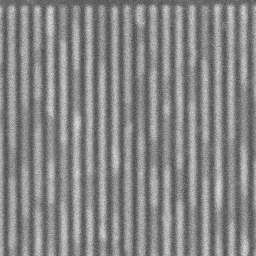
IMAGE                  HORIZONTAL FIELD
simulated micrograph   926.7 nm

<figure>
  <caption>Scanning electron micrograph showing parallel lines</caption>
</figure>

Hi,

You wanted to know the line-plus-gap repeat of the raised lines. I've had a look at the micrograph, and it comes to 46.8 nm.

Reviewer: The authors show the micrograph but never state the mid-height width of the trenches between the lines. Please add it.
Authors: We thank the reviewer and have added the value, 28.1 nm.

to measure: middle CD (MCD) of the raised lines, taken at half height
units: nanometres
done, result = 19